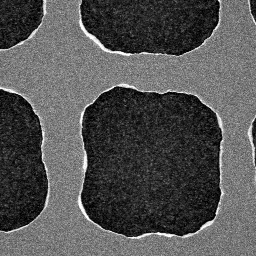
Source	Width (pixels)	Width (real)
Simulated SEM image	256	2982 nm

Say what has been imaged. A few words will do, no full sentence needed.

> holes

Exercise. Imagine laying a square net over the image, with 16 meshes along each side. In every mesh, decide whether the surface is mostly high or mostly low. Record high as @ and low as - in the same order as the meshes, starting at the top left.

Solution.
---@@---------@@
---@@---------@@
--@@@@-------@@@
@@@@@@@@@@@@@@@@
@@@@@@@@@@@@@@@@
@@@@@@@-@@@@@@@@
--@@@@-------@@@
--@@@---------@@
---@@---------@@
---@@---------@@
---@@---------@@
---@@---------@@
---@@---------@@
--@@@@-------@@@
@@@@@@@-----@@@@
@@@@@@@@@@@@@@@@